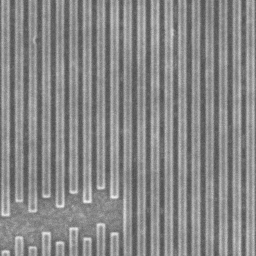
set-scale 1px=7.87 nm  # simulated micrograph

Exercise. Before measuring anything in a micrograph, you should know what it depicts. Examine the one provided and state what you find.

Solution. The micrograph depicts parallel lines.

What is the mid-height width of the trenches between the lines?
54.1 nm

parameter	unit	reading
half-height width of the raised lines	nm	54.1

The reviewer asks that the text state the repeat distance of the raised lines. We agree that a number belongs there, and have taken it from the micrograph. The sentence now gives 107 nm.